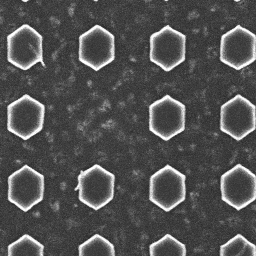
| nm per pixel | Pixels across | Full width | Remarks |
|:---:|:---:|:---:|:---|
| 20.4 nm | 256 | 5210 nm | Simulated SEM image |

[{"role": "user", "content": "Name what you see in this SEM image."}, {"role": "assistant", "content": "a regular array of raised bodies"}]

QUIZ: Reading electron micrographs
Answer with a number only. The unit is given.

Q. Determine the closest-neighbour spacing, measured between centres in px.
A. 69.9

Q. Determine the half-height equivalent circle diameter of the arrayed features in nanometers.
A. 766